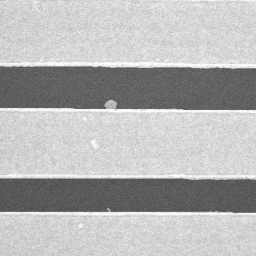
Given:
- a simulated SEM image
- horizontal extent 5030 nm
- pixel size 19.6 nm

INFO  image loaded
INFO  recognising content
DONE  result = lines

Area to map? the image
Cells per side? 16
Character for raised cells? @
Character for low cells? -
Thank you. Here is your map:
@@@@@@@@@@@@@@@@
@@@@@@@@@@@@@@@@
@@@@@@@@@@@@@@@@
@@@@@@@@@@@@@@@@
----------------
----------------
----------------
@@@@@@@@@@@@@@@@
@@@@@@@@@@@@@@@@
@@@@@@@@@@@@@@@@
@@@@@@@@@@@@@@@@
----------------
----------------
@@@@@@@@@@@@@@@@
@@@@@@@@@@@@@@@@
@@@@@@@@@@@@@@@@